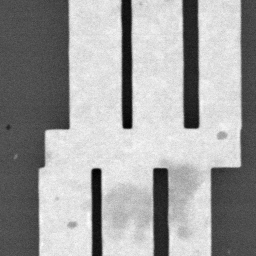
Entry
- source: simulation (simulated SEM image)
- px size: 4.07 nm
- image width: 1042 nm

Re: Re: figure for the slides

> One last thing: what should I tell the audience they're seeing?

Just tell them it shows groups of lines, slits or small figures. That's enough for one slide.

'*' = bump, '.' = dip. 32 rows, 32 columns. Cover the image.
.........******..******..*****..
.........******..******..*****..
.........******..******..*****..
.........******..******..*****..
.........******..******..*****..
.........******..******..*****..
.........******..******..*****..
.........******..******..*****..
.........******..******..*****..
.........******..******..*****..
.........******..******..*****..
.........******..******..*****..
.........******..******..*****..
.........******..******..*****..
.........******..******..*****..
.........******..******..*****..
......************************..
......************************..
......************************..
......************************..
......************************..
.....******..******..*****......
.....******..******..*****......
.....******..******..*****......
.....******..******..*****......
.....******..******..*****......
.....******..******..*****......
.....******..******..*****......
.....******..******..*****......
.....******..******..*****......
.....******..******..*****......
.....******..******..*****......